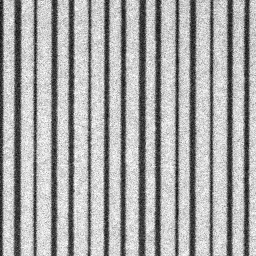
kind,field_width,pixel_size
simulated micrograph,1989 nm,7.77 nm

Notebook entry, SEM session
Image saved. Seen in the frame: parallel lines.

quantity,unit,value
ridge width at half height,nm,91.3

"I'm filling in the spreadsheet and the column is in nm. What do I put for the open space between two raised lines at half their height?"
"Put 49.5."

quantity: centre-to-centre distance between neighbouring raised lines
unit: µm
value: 0.137